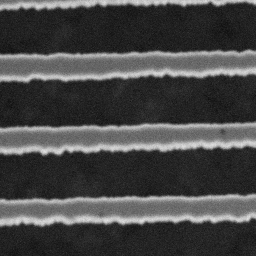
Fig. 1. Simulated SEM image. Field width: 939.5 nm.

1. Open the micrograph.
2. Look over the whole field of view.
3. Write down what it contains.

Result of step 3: lines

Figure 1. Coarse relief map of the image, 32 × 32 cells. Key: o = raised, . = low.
oooooooooooo...............o....
................................
................................
................................
................................
................................
...................o.....ooooooo
oooooooooooooooooooooooooooooooo
oooooooooooooooooooooooooooooooo
ooooooooooooooooo...............
................................
................................
................................
................................
................................
.............................ooo
oooooooooooooooooooooooooooooooo
oooooooooooooooooooooooooooooooo
ooooooooooooooooooo.o...........
................................
................................
................................
................................
................................
..........................oooooo
oooooooooooooooooooooooooooooooo
oooooooooooooooooooooooooooooooo
ooooooooooooooooooooooo.oooo.oo.
................................
................................
................................
................................